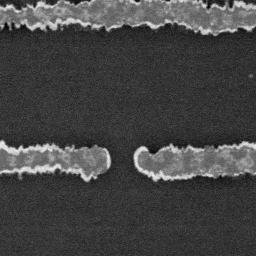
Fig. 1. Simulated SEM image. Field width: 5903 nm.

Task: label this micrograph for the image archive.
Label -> one or a few lines or trenches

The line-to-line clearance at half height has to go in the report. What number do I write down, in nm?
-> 2840